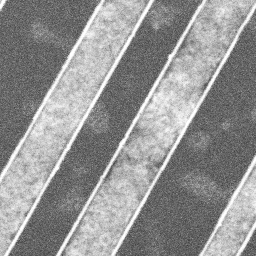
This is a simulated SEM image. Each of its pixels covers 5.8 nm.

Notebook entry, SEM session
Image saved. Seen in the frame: one or a few lines or trenches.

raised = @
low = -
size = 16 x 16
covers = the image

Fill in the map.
@@@@@@---@@@@---
@@@@@@---@@@---@
@@@@@---@@@----@
@@@@---@@@@---@@
@@@@---@@@----@@
@@@---@@@@---@@@
@@@---@@@---@@@@
@@---@@@----@@@@
@@---@@@---@@@@@
@---@@@----@@@@@
---@@@@---@@@@@@
---@@@----@@@@@-
--@@@@---@@@@@@-
--@@@---@@@@@@--
-@@@@---@@@@@---
-@@@---@@@@@@--@